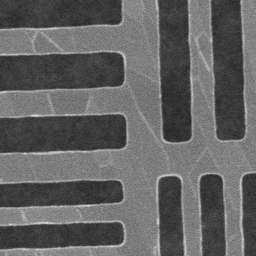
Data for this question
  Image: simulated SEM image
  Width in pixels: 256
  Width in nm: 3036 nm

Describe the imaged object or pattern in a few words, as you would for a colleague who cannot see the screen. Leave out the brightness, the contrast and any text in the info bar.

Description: groups of lines, slits or small figures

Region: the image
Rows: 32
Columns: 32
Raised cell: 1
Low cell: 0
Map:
00000000000000011111000011000011
00000000000000011111000011000011
00000000000000011111000011000011
00000000111111111111000011000011
11111111111111111111000011000011
11111111111111111111000011000011
11111111111100111111000011100011
00000000000000001111000011100001
00000000000000001111000011100001
00000000000000001111000011100001
00000000000000011111000011100001
01101111111111111111000011100001
11111111111111111111000011100001
11111111111111111111000011100001
11100000000000001111000011100001
00000000000000001111000011100001
00000000000000001111000011100001
00000000000000001111000011100011
00000000000000011111111111111111
11111111111111111111111111111111
11111111111111111111111111111111
11111111111111111111111111111111
11111111110111111111000110001100
00000000000000011111000110001100
00000000000000001111000110001100
00000000000001111111000110001100
11111111111111111111000110001100
11111111111111111111000110001100
00000000000000001111000110001100
00000000000000001111000110001100
00000000000000011111000110001100
11111111111111111111000110001100